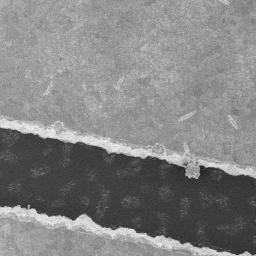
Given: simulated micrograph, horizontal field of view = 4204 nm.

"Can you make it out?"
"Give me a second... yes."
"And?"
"one or a few lines or trenches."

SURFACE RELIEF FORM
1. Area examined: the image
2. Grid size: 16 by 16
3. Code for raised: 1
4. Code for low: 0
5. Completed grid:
1111111111111111
1111111111111111
1111111111111111
1111111111111111
1111111111111111
1111111111111111
1111111111111111
1111111111111111
0000111111111111
0000000001111111
0000000000001011
0000000000000000
0000000000000000
1100000000000000
1111111000000000
1111111111110000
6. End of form